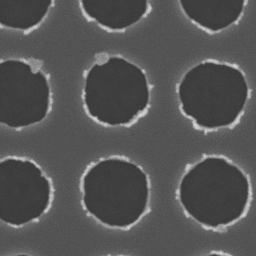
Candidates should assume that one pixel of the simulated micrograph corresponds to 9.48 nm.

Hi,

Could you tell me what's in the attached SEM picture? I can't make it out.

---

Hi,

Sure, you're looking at holes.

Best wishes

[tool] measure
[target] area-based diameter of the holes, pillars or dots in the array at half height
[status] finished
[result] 0.629 um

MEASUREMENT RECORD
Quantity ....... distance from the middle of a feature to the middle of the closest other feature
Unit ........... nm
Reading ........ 926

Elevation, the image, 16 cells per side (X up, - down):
---XX----XX----X
--XXXX--XXXX--XX
XXXXXXXXXXXXXXXX
XXXXXXXXXXXXXXXX
--XXXX---XXX---X
---XX----XX----X
---XX----XX----X
--XXXX--XXXX---X
XXXXXXXXXXXXXXXX
XXXXXXXXXXXXXXXX
--XXXX---XXX---X
---XX----XX----X
---XX----XX----X
--XXXX---XXX---X
XXXXXXXXXXXXXXXX
XXXXXXXXXXXXXXXX